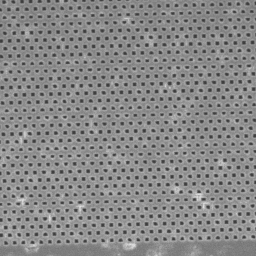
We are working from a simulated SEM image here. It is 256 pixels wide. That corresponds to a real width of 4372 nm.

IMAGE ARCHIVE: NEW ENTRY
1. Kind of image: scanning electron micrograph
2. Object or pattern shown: a regular array of holes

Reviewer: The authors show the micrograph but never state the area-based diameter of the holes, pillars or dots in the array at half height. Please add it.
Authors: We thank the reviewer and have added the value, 69.5 nanometers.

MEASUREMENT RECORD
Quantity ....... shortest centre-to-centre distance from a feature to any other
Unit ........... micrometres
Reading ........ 0.142